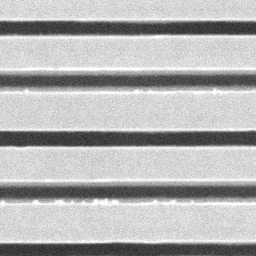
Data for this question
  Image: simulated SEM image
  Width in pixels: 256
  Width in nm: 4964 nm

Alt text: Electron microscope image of lines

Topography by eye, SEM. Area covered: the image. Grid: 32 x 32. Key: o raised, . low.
oooooooooooooooooooooooooooooooo
oooooooooooooooooooooooooooooooo
.........ooo......ooo...........
................................
................................
oooooooooooooooooooooooooooooooo
oooooooooooooooooooooooooooooooo
oooooooooooooooooooooooooooooooo
oooooooooooooooooooooooooooooooo
................................
................................
oooooooooooooooooooooooooooooooo
oooooooooooooooooooooooooooooooo
oooooooooooooooooooooooooooooooo
oooooooooooooooooooooooooooooooo
oooooooooooooooooooooooooooooooo
................................
................................
oooooooooooooooooooooooooooooooo
oooooooooooooooooooooooooooooooo
oooooooooooooooooooooooooooooooo
oooooooooooooooooooooooooooooooo
oooooooooooooooooooooooooooooooo
................................
................................
oooooooooooooooooooooooooooooooo
oooooooooooooooooooooooooooooooo
oooooooooooooooooooooooooooooooo
oooooooooooooooooooooooooooooooo
oooooooooooooooooooooooooooooooo
................................
................................